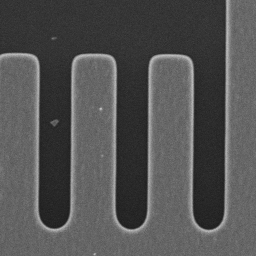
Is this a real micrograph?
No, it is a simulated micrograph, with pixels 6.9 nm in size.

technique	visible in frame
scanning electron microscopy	groups of lines, slits or small figures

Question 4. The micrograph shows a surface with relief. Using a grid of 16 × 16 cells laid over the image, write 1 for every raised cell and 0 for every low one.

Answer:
0000000000000011
0000000000000011
0000000000000011
1100011000100011
1100111001110011
1100111001110011
1100111001110011
1100111001110011
1100111001110011
1100111001110011
1100111001110011
1100111001110011
1100111001110011
1100111001110011
1111111111111111
1111111111111111